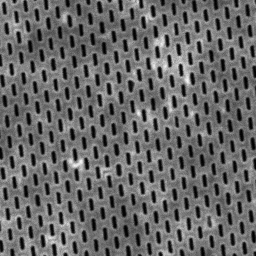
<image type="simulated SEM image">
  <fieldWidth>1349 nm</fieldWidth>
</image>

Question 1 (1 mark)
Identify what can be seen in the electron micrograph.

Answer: a regular array of holes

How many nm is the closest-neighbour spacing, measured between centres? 75.9